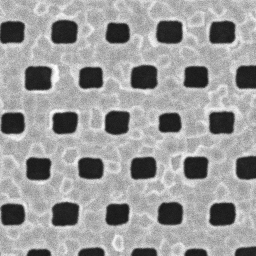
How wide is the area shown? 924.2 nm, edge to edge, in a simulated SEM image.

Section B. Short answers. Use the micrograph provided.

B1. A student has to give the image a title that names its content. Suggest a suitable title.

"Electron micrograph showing a regular array of holes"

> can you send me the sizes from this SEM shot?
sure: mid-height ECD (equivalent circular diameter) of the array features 93.4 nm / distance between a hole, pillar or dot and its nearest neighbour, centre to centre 0.187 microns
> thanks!